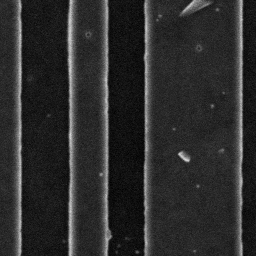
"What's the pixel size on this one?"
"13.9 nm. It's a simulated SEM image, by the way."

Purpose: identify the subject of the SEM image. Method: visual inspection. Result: lines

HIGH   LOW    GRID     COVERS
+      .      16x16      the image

+...+++..++++++.
+...+++..++++++.
+...+++..++++++.
+...+++..++++++.
+...+++..++++++.
+...+++..++++++.
+...+++..++++++.
+...+++..++++++.
+...+++..++++++.
+...+++..++++++.
+...+++..++++++.
+...+++..++++++.
+...+++..++++++.
+...+++..++++++.
+...+++..++++++.
+...+++..++++++.